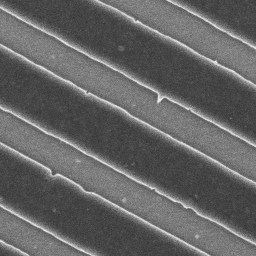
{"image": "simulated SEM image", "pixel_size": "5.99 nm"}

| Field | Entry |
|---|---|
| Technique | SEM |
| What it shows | one or a few lines or trenches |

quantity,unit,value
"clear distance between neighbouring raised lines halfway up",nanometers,189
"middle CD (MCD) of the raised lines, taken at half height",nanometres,328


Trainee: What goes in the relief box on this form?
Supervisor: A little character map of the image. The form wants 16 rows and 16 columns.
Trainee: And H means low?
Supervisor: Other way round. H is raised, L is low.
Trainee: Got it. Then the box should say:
HHHHHHHLLLLHHHHH
LLHHHHHHHLLLLHHH
LLLLHHHHHHHLLLLH
HLLLLHHHHHHHHLLL
HHHLLLLHHHHHHHHL
HHHHHLLLLHHHHHHH
HHHHHHHLLLLHHHHH
LHHHHHHHHLLLLHHH
LLLHHHHHHHHLLLLH
HLLLLHHHHHHHHLLL
HHHLLLLHHHHHHHLL
HHHHHLLLLHHHHHHH
HHHHHHHLLLLHHHHH
LHHHHHHHHLLLLHHH
LLLHHHHHHHLLLLHH
HLLLLHHHHHHHLLLL